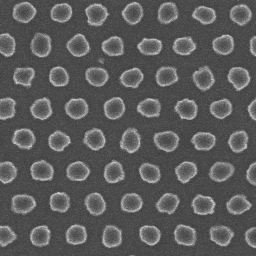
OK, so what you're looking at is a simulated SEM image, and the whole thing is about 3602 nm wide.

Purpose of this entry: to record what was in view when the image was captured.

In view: a regular array of raised bodies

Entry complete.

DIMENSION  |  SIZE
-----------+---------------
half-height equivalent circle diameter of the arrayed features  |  0.28 microns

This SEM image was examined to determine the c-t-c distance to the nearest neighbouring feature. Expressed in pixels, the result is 34.9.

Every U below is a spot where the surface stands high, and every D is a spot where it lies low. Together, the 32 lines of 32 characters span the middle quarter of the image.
DDDDDDDDDDDDDDDDDDDDDDDDDDDDDDDD
DDDDDDUUUUDDDDDDDUUDDDDDUUUUDDDD
UDDDDDUUUUUDDDDUUUUDDDDUUUUUDDDD
UDDDDDUUUUUDDDUUUUUUDDDUUUUUDDDD
UDDDDDUUUUDDDDDUUUUDDDDUUUUDDDDD
DDDDDDDDDDDDDDDDDUDDDDDDDDDDDDDD
DDDDDDDDDDDDDDDDDDDDDDDDDDDDDDDD
DDDDDDDDDDDDDDDDDDDDDDDDDDDDDDDD
DDDDDDDDDDDDDDDDDDDDDDDDDDDDDDDD
DUUUUDDDDDDUUUUDDDDUUUUUDDDDDUUU
DUUUUUDDDDUUUUUDDDDUUUUUDDDDUUUU
DUUUUUDDDDUUUUUDDDUUUUUUDDDDUUUU
DUUUUDDDDDUUUUDDDDDDUUUUDDDDDUUU
DDUUDDDDDDDUUDDDDDDDDDDDDDDDDUUU
DDDDDDDDDDDDDDDDDDDDDDDDDDDDDDDD
DDDDDDDDDDDDDDDDDDDDDDDDDDDDDDDD
DDDDDDDUDDDDDDDDDDDDDDDDDDDDDDDD
DDDDDDUUUUDDDDDUUUDDDDDUUUUUDDDD
UDDDDUUUUUDDDDDUUUUDDDDUUUUUDDDD
UDDDDUUUUUDDDDDUUUUDDDDUUUUUDDDD
DDDDDDUUUUDDDDUUUUUDDDDUUUUUDDDD
DDDDDDDDDDDDDDDDUUDDDDDDDUUDDDDD
DDDDDDDDDDDDDDDDDDDDDDDDDDDDDDDD
DDDDDDDDDDDDDDDDDDDDDDDDDDDDDDDD
DDDDDDDDDDDDDDDDDDDDDDDDDDDDDDDD
DUUUUDDDDDDUUUDDDDDDUUDDDDDDDUUU
DUUUUUDDDDUUUUUDDDDUUUUUDDDDUUUU
DUUUUUDDDDUUUUUDDDDUUUUUDDDDUUUU
DDUUUDDDDDUUUUDDDDDDUUUUDDDDDUUU
DDDDDDDDDDDUDDDDDDDDDDDDDDDDDDDD
DDDDDDDDDDDDDDDDDDDDDDDDDDDDDDDD
DDDDDDDDDDDDDDDDDDDDDDDDDDDDDDDD